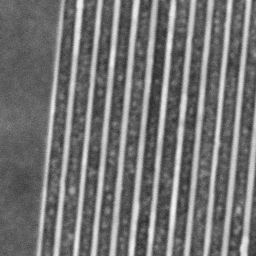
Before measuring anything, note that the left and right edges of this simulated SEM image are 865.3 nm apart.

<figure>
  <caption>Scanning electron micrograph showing parallel lines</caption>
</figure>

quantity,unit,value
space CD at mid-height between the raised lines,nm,48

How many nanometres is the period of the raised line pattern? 63.1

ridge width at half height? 16 nm